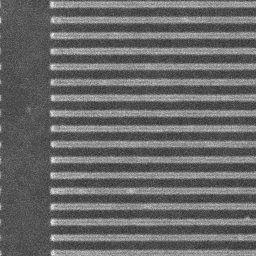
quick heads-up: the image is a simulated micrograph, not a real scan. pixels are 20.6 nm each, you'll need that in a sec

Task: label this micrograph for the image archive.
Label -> parallel lines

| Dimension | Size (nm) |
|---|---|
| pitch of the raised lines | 320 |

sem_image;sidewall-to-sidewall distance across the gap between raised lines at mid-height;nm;216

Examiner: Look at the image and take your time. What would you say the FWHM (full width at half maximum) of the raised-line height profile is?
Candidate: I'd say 97.7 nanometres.